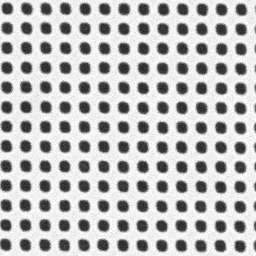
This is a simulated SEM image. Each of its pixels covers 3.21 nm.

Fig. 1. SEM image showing a regular array of holes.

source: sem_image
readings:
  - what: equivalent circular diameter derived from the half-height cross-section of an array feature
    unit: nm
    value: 40.2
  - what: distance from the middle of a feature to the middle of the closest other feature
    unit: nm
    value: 62.1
